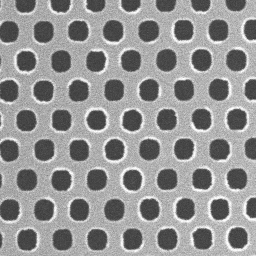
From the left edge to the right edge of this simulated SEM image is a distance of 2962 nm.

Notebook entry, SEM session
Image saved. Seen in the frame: a regular array of holes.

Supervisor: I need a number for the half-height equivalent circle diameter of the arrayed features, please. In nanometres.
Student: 253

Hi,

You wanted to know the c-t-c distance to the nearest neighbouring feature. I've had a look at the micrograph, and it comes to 396 nm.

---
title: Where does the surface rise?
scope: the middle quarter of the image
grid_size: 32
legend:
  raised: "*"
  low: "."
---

..****....****.....****.....****
.*****....*****...******...*****
********************************
********************************
**...******...*****....*****....
*.....****.....****.....***.....
*.....****.....****.....***.....
*.....****.....****.....***.....
*.....****.....****....*****....
***.****************************
********************************
.******..*******..******...*****
..****....*****....****.....****
..****.....****.....***.....****
..****.....****.....***.....****
..****....*****....****.....****
.*******.*******...*****...*****
********************************
*****************************..*
**....*****....****.....****....
*.....****.....****.....****....
*.....****.....****.....***.....
*.....****.....****.....****....
**....*****....****....*****....
********************************
********************************
.******...*******.******....****
..****.....****....****.....****
..****.....****.....***.....****
..****.....****....****.....****
..****....*****....****.....****
.******..*******..*******.******